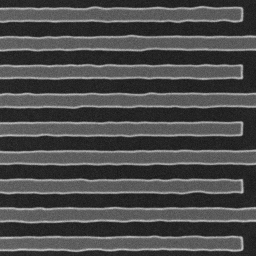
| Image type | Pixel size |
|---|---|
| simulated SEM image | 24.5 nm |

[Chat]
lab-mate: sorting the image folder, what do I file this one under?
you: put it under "groups of lines, slits or small figures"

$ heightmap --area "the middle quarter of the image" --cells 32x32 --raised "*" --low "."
********.*************.*********
********************************
********************************
*....**....****.....**....***...
................................
................................
................................
......**....***......***.*******
********************************
********************************
********************************
................................
................................
................................
................................
********************************
********************************
********************************
................................
................................
................................
................................
********************************
********************************
********************************
................................
................................
................................
................................
********************************
********************************
********************************